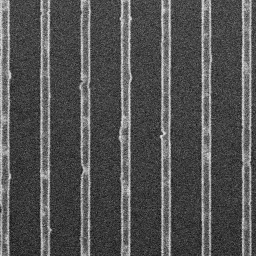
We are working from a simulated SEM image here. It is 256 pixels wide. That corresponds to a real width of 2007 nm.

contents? parallel lines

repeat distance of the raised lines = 40.3 px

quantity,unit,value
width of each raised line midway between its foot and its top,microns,0.0608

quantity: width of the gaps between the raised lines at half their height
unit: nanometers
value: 255